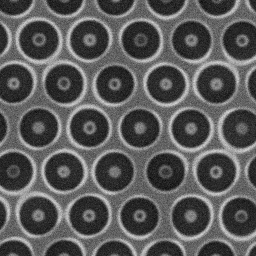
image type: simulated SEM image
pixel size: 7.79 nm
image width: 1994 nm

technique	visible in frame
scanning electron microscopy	an array of small figures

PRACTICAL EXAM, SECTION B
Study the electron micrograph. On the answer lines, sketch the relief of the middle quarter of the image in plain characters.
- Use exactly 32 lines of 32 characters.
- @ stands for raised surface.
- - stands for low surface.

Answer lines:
---@@@@@@@@----@@@@@@@@----@@@@@
----@@@@@-------@@@@@@-------@@@
-----@@@---------@@@@---------@@
-----@@@----------@@-----------@
@----@@@----@@----@@-----@-----@
@----@@-----@@----@@-----@-----@
-----@@@----------@@@----------@
-----@@@---------@@@@---------@@
----@@@@@-------@@@@@@-------@@@
---@@@@@@@-----@@@@@@@@-----@@@@
@@@@@@@@@@@@@@@@@@@@@@@@@@@@@@@@
@@@------@@@@@@@@----@@@@@@@@---
@@--------@@@@@@-------@@@@@----
@@---------@@@@---------@@@-----
@----------@@@----------@@@-----
@----@@-----@@----@@----@@@----@
@----@@-----@@----@@----@@-----@
@----------@@@----------@@@-----
@@---------@@@---------@@@@-----
@@--------@@@@@--------@@@@@----
@@@@-----@@@@@@@-----@@@@@@@@---
@@@@@@@@@@@@@@@@@@@@@@@@@@@@@@@-
---@@@@@@@-----@@@@@@@@-----@@@@
----@@@@@-------@@@@@@--------@@
-----@@@---------@@@@---------@@
-----@@@----------@@@----------@
@----@@-----@-----@@@---@@@----@
@----@@-----@----@@@@---@@@---@@
-----@@@---------@@@@---------@@
-----@@@---------@@@@---------@@
----@@@@@-------@@@@@@-------@@@
--@@@@@@@@-----@@@@@@@@-----@@@@